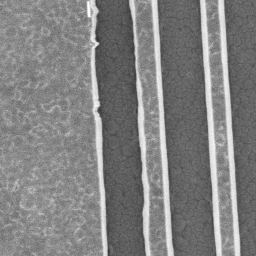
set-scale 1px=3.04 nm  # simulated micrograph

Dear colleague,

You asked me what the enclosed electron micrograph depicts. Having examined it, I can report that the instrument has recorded one or a few lines or trenches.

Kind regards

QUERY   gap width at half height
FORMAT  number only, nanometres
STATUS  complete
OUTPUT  139